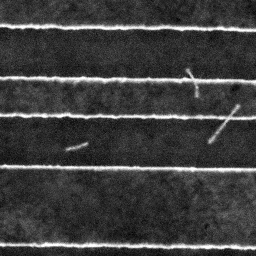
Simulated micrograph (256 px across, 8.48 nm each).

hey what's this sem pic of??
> lines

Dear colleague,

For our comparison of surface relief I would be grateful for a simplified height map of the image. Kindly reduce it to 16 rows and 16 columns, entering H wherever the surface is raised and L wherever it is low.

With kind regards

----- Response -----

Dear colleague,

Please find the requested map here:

HHHHHHHHHHHHHHHH
HHHHHHHHHHHHHHHH
LLLLLLLLLLLLLLLL
LLLLLLLLLLLLLLLL
LLLLLLLLLLLLLLLL
HHHHHHHHHHHHHHHH
HHHHHHHHHHHHHHHH
LLLLLLLLLLLLLLLL
LLLLLLLLLLLLLLLL
LLLLLLLLLLLLLLLL
HHHHHHHHHHHHHLLL
HHHHHHHHHHHHHHHH
HHHHHHHHHHHHHHHH
HHHHHHHHHHHHHHHH
HHHHHHHHHHHHHHHH
LLLLLLLLLLLLHHHH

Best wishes